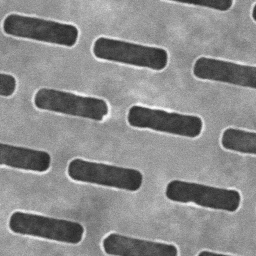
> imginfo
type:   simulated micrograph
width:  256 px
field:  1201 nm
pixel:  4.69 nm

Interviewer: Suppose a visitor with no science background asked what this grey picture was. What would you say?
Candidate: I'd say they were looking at holes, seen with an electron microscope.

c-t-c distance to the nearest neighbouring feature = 0.369 um